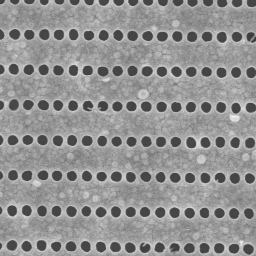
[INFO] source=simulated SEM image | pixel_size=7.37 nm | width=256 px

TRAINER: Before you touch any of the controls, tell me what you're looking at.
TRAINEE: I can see a regular array of holes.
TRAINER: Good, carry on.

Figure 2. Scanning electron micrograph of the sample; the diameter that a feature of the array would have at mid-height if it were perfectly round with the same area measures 75.8 nanometers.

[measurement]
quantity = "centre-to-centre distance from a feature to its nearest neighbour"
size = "14.5 pixels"